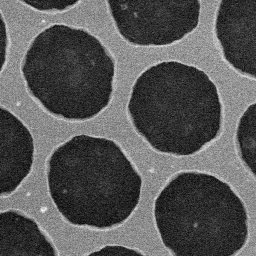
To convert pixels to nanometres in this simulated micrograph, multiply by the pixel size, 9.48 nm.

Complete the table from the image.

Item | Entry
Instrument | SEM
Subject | holes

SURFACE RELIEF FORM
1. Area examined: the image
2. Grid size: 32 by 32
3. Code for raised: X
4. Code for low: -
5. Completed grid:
XXX------XXXX------------XX-----
XXXXXXXXXXXXXX-----------XX-----
XXXXXXXXXXXXXX-----------XX-----
-XXXXX---XXXXXX---------XXX-----
-XXXX-------XXX--------XXXX-----
-XXX---------XXX-----XXXXXXX----
-XX----------XXXXXXXXXXXXXXX----
-XX-----------XXXXXXXXXXXXXX----
XXX-----------XXXXX-----XXXXX---
XXX-----------XXX---------XXXXX-
XXX-----------XXX----------XXXXX
XXXX----------XX-----------XXXXX
XXXXX---------XX-----------XXXXX
-XXXXX-------XXX------------XXX-
--XXXXX-----XXXX------------XX--
---XXXXXXXXXXXXXX-----------XX--
----XXXXXXXXXXXXX----------XXX--
----XXXXX-----XXXX--------XXX---
----XXX--------XXXX------XXXXX--
----XX----------XXXXXXXXXXXXXX--
----XX----------XXXXXXXXXXXXXX--
----XX-----------XXXXXX-XXXXXXX-
---XXX------------XXX------XXXXX
--XXXX------------XXX--------XXX
XXXXXX-----------XXX----------XX
XXXXXXX----------XX-----------XX
X-XXXXXX--------XXX------------X
----XXXX--------XXX------------X
-----XXXXXXXXXXXXXXX-----------X
------XXXXXXXXXXXXXX-----------X
------XXXXXXXXXXXXXXX----------X
-------XXXXX-----XXXX---------XX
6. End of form